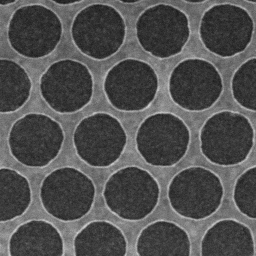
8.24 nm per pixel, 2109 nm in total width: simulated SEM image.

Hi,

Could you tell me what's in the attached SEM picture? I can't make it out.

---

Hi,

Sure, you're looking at a regular array of holes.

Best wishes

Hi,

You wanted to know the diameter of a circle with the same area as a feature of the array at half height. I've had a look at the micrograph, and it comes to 444 nanometres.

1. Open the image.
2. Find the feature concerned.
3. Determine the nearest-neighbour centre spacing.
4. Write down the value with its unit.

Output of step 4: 0.514 microns